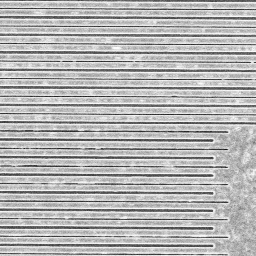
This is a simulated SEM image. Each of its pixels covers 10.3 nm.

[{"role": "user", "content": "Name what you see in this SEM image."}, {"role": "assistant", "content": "parallel lines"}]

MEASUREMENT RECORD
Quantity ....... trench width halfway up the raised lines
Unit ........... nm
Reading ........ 29.5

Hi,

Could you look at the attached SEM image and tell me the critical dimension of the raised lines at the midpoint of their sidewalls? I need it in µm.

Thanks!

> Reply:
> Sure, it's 0.0693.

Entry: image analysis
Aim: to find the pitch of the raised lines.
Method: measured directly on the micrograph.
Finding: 89.8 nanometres